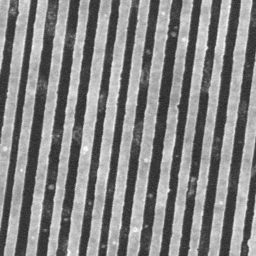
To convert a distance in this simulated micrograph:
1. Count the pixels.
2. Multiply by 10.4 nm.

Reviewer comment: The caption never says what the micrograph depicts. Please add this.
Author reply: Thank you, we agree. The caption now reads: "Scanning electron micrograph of parallel lines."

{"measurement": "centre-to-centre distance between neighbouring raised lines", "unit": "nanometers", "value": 210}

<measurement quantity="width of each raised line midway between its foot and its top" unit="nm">106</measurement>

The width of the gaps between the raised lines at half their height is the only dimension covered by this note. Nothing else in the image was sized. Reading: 0.106 micrometres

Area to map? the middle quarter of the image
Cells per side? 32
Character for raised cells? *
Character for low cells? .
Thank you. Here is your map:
..**...***..***..**...***...**..
..**...***..**...**...***...**..
..**...**...**...**...**...***..
..**...**...**...**...**...***..
..**...**...**..***..***...**...
..**..***..***..***..***...**...
.**...***..***..***..***...**...
.**...***..**...**...***...**...
.**...**...**...**...***...**..*
.**...**...**...**...***..***..*
.**...**...**...**...**...**...*
.**...**...**...**..***...**...*
***..***..***..***..***...**...*
**...***..***..***..***...**...*
***..***..***..***..***...**...*
**...***..**...**...***...**...*
**...**...**...**...***...**..**
**...***..**...**...**...***..**
**...**...**...**...**...***..**
**...**...**..***..***...***..**
**..***..***..***..***...**...**
*...***..***..***..***...**...**
*...***..***..**...***...**...**
*...**...**...**...***...**...**
*...***..**...**...***..***..***
*...**...**...**...**...***..***
*..***..***...**...**...**...***
*..***..***..***...**...**...**.
...***..***..***..***...**...**.
...***..***..***..***...**...**.
...***..**...**...***...**...**.
...**...***..**...***..***..***.